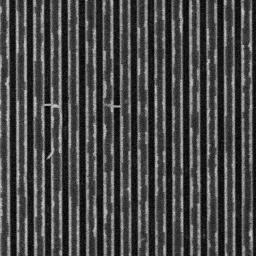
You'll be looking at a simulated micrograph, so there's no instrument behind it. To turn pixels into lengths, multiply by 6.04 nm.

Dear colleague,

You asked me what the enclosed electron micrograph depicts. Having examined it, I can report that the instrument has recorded parallel lines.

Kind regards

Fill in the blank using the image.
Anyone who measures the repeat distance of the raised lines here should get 17.3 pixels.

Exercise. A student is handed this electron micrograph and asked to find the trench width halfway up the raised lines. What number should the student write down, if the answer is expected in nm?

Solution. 41.5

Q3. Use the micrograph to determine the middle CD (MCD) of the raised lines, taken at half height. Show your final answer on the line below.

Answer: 59.6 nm